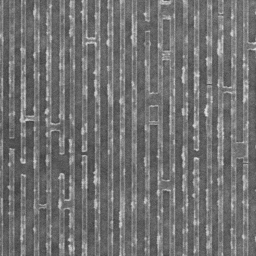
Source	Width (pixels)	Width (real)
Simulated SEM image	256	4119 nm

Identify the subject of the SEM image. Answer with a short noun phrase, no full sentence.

parallel lines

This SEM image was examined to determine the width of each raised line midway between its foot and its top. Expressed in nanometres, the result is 78.5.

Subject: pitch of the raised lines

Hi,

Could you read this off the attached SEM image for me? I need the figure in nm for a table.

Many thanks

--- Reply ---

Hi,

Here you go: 198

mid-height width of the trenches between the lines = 7.63 px